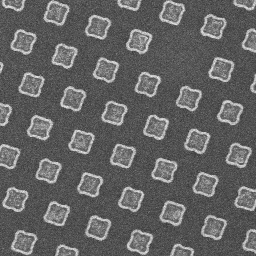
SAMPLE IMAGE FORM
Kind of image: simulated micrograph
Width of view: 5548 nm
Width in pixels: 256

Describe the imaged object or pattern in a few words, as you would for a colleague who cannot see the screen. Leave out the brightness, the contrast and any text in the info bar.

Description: a regular array of raised bodies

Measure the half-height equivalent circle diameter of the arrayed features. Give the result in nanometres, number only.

471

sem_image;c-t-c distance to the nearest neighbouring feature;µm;0.944